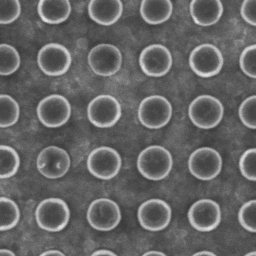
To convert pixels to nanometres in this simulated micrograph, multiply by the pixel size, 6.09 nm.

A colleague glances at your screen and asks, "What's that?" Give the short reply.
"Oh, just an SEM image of a regular array of raised bodies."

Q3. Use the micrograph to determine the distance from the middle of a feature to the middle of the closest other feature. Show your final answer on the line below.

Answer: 308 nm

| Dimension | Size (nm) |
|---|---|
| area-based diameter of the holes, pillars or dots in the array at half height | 192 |